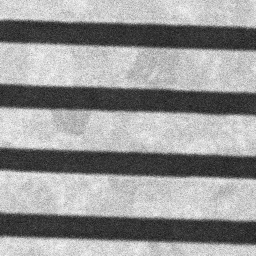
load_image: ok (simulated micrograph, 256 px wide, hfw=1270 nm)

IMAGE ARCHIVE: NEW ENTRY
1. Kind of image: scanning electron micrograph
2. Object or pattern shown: one or a few lines or trenches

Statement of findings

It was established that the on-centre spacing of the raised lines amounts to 320 nm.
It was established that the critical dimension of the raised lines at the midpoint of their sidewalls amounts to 192 nm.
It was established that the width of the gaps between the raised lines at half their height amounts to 128 nm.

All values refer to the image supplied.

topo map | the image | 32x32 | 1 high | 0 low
11111111111111111111111111111111
11111111111111111111111111111111
00000000111111111111111111111111
00000000000000000000000000000000
00000000000000000000000000000000
00000000000000000000000000000000
11111111111111111111111111111000
11111111111111111111111111111111
11111111111111111111111111111111
11111111111111111111111111111111
00001111111111111111111111111111
00000000000000000000000000000000
00000000000000000000000000000000
00000000000000000000000000000000
11111111111111111111111111100000
11111111111111111111111111111111
11111111111111111111111111111111
11111111111111111111111111111111
00000011111111111111111111111111
00000000000000000000000000000000
00000000000000000000000000000000
00000000000000000000000000000000
11111111111111111111111111100000
11111111111111111111111111111111
11111111111111111111111111111111
11111111111111111111111111111111
00111111111111111111111111111111
00000000000000000000000000000000
00000000000000000000000000000000
00000000000000000000000000000000
11111111111111111111111000000000
11111111111111111111111111111111